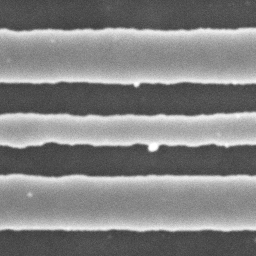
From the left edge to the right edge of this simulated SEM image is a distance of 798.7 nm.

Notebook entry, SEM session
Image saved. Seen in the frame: lines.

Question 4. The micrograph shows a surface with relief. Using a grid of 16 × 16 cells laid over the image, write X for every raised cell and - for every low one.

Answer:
----------------
----------------
XXXXXXXXXXXXXXXX
XXXXXXXXXXXXXXXX
XXXXXXXXXXXXXXXX
----------------
----------------
XXXXXXXXXXXXXXXX
XXXXXXXXXXXXXXXX
----------------
----------------
XXXXXXXXXXXXXXXX
XXXXXXXXXXXXXXXX
XXXXXXXXXXXXXXXX
----------------
----------------